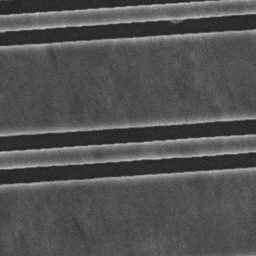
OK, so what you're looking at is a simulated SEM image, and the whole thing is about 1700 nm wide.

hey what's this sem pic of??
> lines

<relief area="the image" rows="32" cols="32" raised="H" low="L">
LLLLLLLLLLLLLLLLLLLLLLHHHHHHHHHH
LLLLLLHHHHHHHHHHHHHHHHHHHHHHHHHH
HHHHHHHHHHHHHHHHHHHHLLLLLLLLLLLL
HHHHHHLLLLLLLLLLLLLLLLLLLLLLLLLL
LLLLLLLLLLLLLLLLLLLHHHHHHHHHHHHH
LLLLLHHHHHHHHHHHHHHHHHHHHHHHHHHH
HHHHHHHHHHHHHHHHHHHHHHHHHHHHHHHH
HHHHHHHHHHHHHHHHHHHHHHHHHHHHHHHH
HHHHHHHHHHHHHHHHHHHHHHHHHHHHHHHH
HHHHHHHHHHHHHHHHHHHHHHHHHHHHHHHH
HHHHHHHHHHHHHHHHHHHHHHHHHHHHHHHH
HHHHHHHHHHHHHHHHHHHHHHHHHHHHHHHH
HHHHHHHHHHHHHHHHHHHHHHHHHHHHHHHH
HHHHHHHHHHHHHHHHHHHHHHHHHHHHHHHH
HHHHHHHHHHHHHHHHHHHHHHHHHHHHHHHH
HHHHHHHHHHHHHHHHHHHHHHHLLLLLLLLL
HHHHHHHHLLLLLLLLLLLLLLLLLLLLLLLL
LLLLLLLLLLLLLLLLLLLLLLHHHHHHHHHH
LLLLLLLHHHHHHHHHHHHHHHHHHHHHHHHH
HHHHHHHHHHHHHHHHHHHHHHHHHHLLLLLL
HHHHHHHHHHHLLLLLLLLLLLLLLLLLLLLL
LLLLLLLLLLLLLLLLLLLLLLLLHHHHHHHH
LLLLLLLLLLHHHHHHHHHHHHHHHHHHHHHH
HHHHHHHHHHHHHHHHHHHHHHHHHHHHHHHH
HHHHHHHHHHHHHHHHHHHHHHHHHHHHHHHH
HHHHHHHHHHHHHHHHHHHHHHHHHHHHHHHH
HHHHHHHHHHHHHHHHHHHHHHHHHHHHHHHH
HHHHHHHHHHHHHHHHHHHHHHHHHHHHHHHH
HHHHHHHHHHHHHHHHHHHHHHHHHHHHHHHH
HHHHHHHHHHHHHHHHHHHHHHHHHHHHHHHH
HHHHHHHHHHHHHHHHHHHHHHHHHHHHHHHH
HHHHHHHHHHHHHHHHHHHHHHHHHHHHHHHH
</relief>